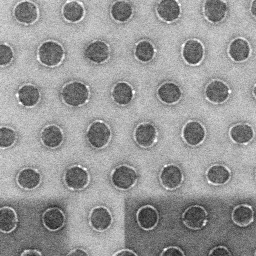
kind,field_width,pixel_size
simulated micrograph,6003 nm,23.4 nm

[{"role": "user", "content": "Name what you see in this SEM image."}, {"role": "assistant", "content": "a regular array of raised bodies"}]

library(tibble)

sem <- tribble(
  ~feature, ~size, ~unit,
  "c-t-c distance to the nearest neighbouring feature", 1100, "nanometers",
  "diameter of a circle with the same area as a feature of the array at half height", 23.5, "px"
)